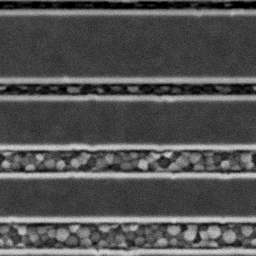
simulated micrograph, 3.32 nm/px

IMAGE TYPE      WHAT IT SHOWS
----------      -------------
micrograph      one or a few lines or trenches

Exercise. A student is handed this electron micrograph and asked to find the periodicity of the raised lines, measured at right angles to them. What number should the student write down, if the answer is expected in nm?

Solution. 251